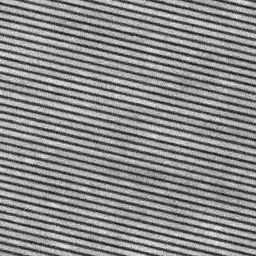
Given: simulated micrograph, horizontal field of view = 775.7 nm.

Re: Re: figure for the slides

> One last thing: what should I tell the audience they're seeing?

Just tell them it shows parallel lines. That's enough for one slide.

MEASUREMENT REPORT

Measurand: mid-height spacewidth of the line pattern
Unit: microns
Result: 0.0104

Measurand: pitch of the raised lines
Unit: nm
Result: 22.7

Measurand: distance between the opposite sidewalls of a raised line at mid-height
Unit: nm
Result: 13.3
